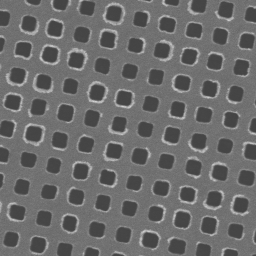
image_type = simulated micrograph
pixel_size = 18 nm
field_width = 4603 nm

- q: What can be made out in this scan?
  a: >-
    a regular array of holes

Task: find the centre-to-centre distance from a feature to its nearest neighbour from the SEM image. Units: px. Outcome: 26.4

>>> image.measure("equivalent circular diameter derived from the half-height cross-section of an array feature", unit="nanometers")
291